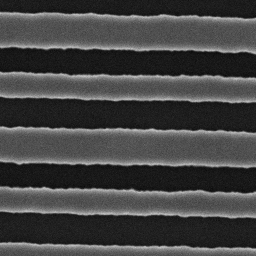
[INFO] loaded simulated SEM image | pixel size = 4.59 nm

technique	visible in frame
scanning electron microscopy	lines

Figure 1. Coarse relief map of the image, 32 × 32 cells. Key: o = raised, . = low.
................................
................................
oooooooooooooooooooooooooooooooo
oooooooooooooooooooooooooooooooo
oooooooooooooooooooooooooooooooo
oooooooooooooooooooooooooooooooo
.............................o.o
................................
................................
oooooooooooooo.oo.oo............
oooooooooooooooooooooooooooooooo
oooooooooooooooooooooooooooooooo
..............o........ooooooooo
................................
................................
................................
oooooooooooooooooooooooooooo....
oooooooooooooooooooooooooooooooo
oooooooooooooooooooooooooooooooo
oooooooooooooooooooooooooooooooo
..........o....ooooooooooooooooo
................................
................................
o...............................
oooooooooooooooooooooooooooooooo
oooooooooooooooooooooooooooooooo
.....ooooooooooooooooooooooooooo
................................
................................
................................
oooo............................
oooooooooooooooooooooooooooooooo